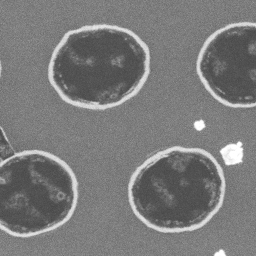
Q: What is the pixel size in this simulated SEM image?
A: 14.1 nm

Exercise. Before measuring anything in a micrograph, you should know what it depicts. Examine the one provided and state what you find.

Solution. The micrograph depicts raised bodies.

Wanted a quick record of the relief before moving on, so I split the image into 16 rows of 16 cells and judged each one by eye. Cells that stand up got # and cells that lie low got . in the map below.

................
................
....#####....###
...######....###
...######...####
....#####....###
.....##.......##
................
................
..........###...
####.....#####..
#####...######..
#####...######..
####.....####...
.##.............
................